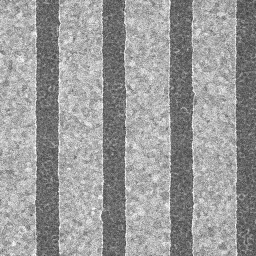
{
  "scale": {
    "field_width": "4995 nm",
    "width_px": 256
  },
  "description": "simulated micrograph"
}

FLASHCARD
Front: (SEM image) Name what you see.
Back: one or a few lines or trenches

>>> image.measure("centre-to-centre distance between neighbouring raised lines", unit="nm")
1300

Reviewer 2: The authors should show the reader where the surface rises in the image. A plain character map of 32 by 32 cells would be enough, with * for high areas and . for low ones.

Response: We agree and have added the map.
*****..******...*****...*****...
****...******...*****...*****...
****...******...*****...******..
****...******..******...*****...
*****..******...*****...*****...
****...******...*****...*****...
****...******...*****...*****...
*****..******...*****...*****...
****...******...*****...*****...
****...******...*****...*****...
****...******...*****...*****...
*****..******...*****...*****...
****...******...*****...*****...
****...******..******...*****...
****...******...*****...*****...
****...******...*****...*****...
****...******...*****...*****...
*****..******...*****...*****...
*****..******...*****...******..
*****..******...*****...*****...
*****..******...*****...******..
****...******...*****...******..
****...******...*****...******..
****...******...*****...******..
****...******...*****...******..
****...******...*****...******..
****...******...*****...******..
****...******...*****...******..
****...******...*****...******..
****...******...*****...******..
*****..******...*****...******..
****...******...*****...******..